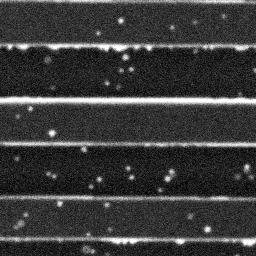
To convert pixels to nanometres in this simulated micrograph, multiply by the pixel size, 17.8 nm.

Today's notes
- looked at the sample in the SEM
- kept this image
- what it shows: lines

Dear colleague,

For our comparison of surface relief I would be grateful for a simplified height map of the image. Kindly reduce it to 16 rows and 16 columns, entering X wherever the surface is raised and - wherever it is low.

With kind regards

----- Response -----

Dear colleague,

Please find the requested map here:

XXXXXXXXXXXXXXXX
XXXXXXXXXXXXXXXX
XXXXXXXXXXXXXXXX
----------------
----------------
----------------
XXXXXXXXXXXXXXXX
XXXXXXXXXXXXXXXX
XXXXXXXXXXXXXXXX
----------------
----------------
----------------
XXXXXXXXXXXXXXXX
XXXXXXXXXXXXXXXX
XXXXXXXXXXXXXXXX
----------------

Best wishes